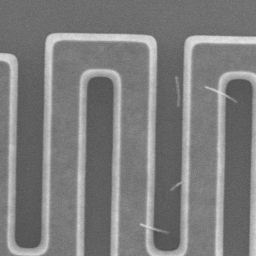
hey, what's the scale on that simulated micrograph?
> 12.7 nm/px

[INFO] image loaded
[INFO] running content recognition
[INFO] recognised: groups of lines, slits or small figures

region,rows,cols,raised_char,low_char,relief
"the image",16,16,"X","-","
----------------
----------------
---XXXXXX---XX--
---XXXXXXX--XXXX
X--XXXXXXX--XXXX
X--XX--XXX--XX--
X--XX--XXX--XX--
X--XX--XXX--XX--
X--XX--XX---XX--
X--XX--XX---XX--
X--XX--XX---XX--
X--XX--XX---XX--
X--XX--XX---XX--
X--XX--XX---XX--
X--XX--XX--XXX--
X-XXX--XXX-XXX--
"